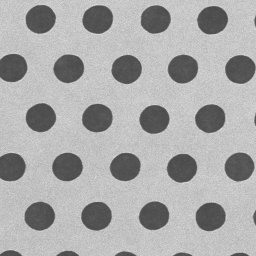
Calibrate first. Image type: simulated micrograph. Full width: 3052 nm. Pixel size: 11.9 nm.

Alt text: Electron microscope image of a regular array of holes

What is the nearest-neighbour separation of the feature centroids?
56.3 pixels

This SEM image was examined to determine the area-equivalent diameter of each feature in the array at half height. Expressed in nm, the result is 353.